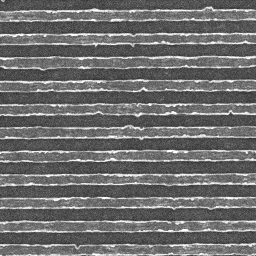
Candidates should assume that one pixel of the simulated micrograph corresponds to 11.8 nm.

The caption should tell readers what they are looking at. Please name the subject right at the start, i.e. parallel lines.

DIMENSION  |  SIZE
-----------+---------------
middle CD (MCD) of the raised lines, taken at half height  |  0.121 micrometres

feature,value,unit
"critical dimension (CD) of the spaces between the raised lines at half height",154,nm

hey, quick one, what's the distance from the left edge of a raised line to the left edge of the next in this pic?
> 278 nm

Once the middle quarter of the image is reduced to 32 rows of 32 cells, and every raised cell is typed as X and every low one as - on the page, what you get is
XXXXXXXXXXXXXXXXXXXXXXXXXXXXXXXX
--------------------------------
--------------------------------
--------------------------------
XXXXXXXXXXXXXXXXXXXXXXXXXXXXXXXX
XXXXXXXXXXXXXXXXXXXXXXXXXXXXXXXX
XXXXXXXXX-XXXXXXXXX-XXXXXX-XXXXX
--------------------------------
--------------------------------
--------------------------------
XXXXXXXXXXXXXXXXXXXXXXXXXXXXXXXX
XXXXXXXXXXXXXXXXXXXXXXXXXXXXXXXX
XXXXXXXX-----XX--XX---XXXX------
--------------------------------
--------------------------------
---------------XX---------------
XXXXXXXXXXXXXXXXXXXXXXXXXXXXXXXX
XXXXXXXXXXXXXXXXXXXXXXXXXXXXXXXX
-XXX---XX-X-XX------------------
--------------------------------
--------------------------------
--------------------------------
XXXXXXXXXXXXXXXXXXXXXXXXXXXXXXXX
XXXXXXXXXXXXXXXXXXXXXXXXXXXXXXXX
--------------------------------
--------------------------------
--------------------------------
--------------------------------
XXXXXXXXXXXXXXXXXXXXXXXXXXXXXXXX
XXXXXXXXXXXXXXXXXXXXXXXXXXXXXXXX
--------------------------X-----
--------------------------------